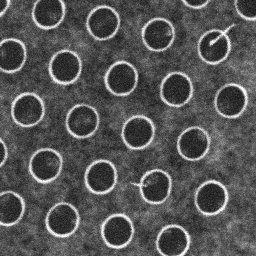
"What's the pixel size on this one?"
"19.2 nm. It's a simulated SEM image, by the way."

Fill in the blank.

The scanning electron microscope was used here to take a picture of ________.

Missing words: a regular array of raised bodies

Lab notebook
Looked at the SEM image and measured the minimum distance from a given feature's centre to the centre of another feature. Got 56.1 px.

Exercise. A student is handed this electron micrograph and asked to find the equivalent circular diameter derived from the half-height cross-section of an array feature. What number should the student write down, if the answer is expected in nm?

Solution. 616